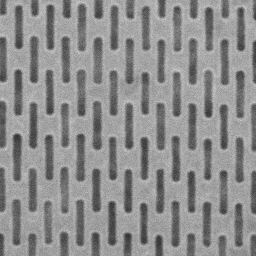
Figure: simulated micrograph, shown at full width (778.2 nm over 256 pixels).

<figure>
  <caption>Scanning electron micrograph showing a regular array of holes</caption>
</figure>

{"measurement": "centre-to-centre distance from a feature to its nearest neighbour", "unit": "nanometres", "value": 96.2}